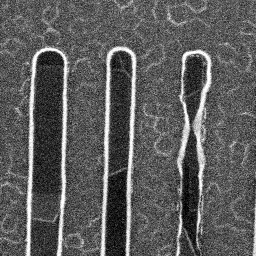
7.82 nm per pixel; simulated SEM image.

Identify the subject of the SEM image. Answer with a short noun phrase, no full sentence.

one or a few lines or trenches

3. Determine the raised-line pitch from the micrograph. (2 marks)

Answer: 565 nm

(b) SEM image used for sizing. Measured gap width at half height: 383 nanometers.